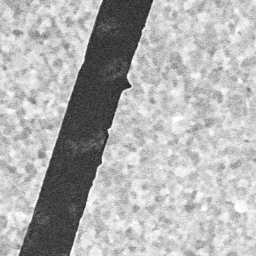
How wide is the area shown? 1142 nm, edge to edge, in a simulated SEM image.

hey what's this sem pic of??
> one or a few lines or trenches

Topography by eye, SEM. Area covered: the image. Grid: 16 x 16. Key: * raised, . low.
******...*******
******...*******
******...*******
*****...********
*****...********
*****...********
****...*********
****...*********
****...*********
***...**********
***...**********
***...**********
**....**********
**...***********
**...***********
*....***********